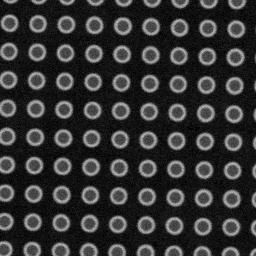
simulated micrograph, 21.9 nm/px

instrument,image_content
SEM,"an array of small figures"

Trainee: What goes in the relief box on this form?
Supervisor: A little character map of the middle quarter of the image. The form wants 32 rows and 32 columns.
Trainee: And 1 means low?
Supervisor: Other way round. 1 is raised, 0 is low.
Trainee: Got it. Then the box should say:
00000000000000000000000000000000
00000000000000000000000000000000
10000011000000000000000000000000
11000111100001110000111000011100
11000111100011110001111100111110
11000111100011110001111100111110
00000011000001110000111000011100
00000000000000000000000000000000
00000000000000000000000000000000
10000000000000000000000000000000
11000111100011110000111000011100
11000111100011110001111000111100
11000111100011110001111000111100
10000011000001100000111000011100
00000000000000000000000000000000
00000000000000000000000000000000
10000000000000000000000000000000
11000111100011110000111000011000
11000111100011110001111000111100
11000111100011110001111000111100
10000011000001100001111000111100
00000000000000000000000000000000
00000000000000000000000000000000
00000000000000000000000000000000
10000111100011100000110000011000
11000111100011110001111000111100
11000111100011110001111000111100
10000111000011100001111000111100
00000000000000000000000000000000
00000000000000000000000000000000
00000000000000000000000000000000
10000111000011100001110000011000